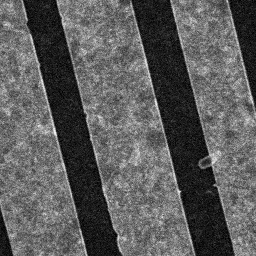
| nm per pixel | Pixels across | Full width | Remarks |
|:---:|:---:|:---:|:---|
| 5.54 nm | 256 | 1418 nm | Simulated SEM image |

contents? one or a few lines or trenches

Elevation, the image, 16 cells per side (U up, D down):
UDDDUUUUDDDUUUDD
UUDDUUUUUDDUUUUD
UUDDUUUUUDDUUUUD
UUDDUUUUUDDDUUUD
UUUDDUUUUDDDUUUD
UUUDDUUUUUDDUUUU
UUUDDUUUUUDDUUUU
UUUDDUUUUUDDDUUU
UUUUDDUUUUDDDUUU
UUUUDDUUUUUDDUUU
UUUUDDUUUUUDDUUU
UUUUDDUUUUUDDDUU
UUUUUDDUUUUDDDUU
UUUUUDDUUUUUDDUU
UUUUUDDUUUUUDDUU
DUUUUDDUUUUUDDDU